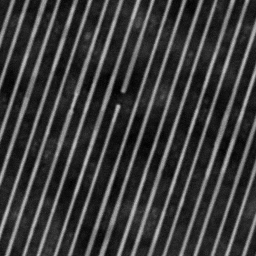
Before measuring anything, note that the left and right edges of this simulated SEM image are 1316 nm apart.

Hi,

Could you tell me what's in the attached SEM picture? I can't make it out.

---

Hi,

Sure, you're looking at parallel lines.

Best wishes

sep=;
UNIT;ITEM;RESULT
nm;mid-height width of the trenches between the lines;61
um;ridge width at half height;0.0152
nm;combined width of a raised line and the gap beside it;76.7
